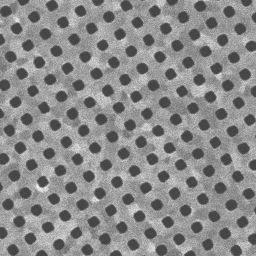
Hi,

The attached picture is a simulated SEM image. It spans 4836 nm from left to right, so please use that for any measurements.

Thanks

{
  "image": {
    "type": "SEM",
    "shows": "a regular array of holes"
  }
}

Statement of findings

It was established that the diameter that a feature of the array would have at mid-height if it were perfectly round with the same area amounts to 222 nm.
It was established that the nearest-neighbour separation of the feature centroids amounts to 384 nm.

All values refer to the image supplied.